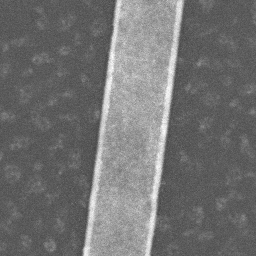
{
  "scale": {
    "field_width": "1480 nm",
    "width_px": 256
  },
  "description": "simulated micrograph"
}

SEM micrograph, one or a few lines or trenches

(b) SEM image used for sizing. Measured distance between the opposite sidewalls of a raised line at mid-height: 0.357 µm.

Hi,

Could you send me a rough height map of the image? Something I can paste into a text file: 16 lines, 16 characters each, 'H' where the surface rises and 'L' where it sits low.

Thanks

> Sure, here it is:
LLLLLLLHHHHLLLLL
LLLLLLLHHHHLLLLL
LLLLLLLHHHHLLLLL
LLLLLLLHHHHLLLLL
LLLLLLLHHHHLLLLL
LLLLLLLHHHHLLLLL
LLLLLLLHHHLLLLLL
LLLLLLHHHHLLLLLL
LLLLLLHHHHLLLLLL
LLLLLLHHHHLLLLLL
LLLLLLHHHHLLLLLL
LLLLLLHHHHLLLLLL
LLLLLLHHHHLLLLLL
LLLLLLHHHHLLLLLL
LLLLLLHHHLLLLLLL
LLLLLHHHHLLLLLLL